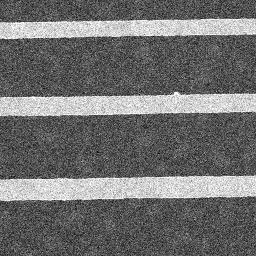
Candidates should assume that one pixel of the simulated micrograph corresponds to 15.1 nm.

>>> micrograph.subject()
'one or a few lines or trenches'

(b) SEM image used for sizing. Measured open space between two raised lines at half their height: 906 nanometres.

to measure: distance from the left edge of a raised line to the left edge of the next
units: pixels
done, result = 79.8